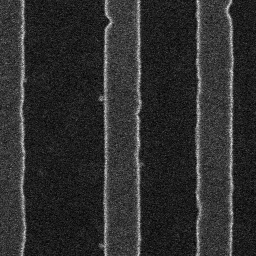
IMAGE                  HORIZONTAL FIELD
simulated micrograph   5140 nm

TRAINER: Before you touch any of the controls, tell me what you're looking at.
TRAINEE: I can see one or a few lines or trenches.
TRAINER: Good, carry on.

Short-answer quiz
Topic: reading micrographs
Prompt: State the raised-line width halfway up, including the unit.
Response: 673 nm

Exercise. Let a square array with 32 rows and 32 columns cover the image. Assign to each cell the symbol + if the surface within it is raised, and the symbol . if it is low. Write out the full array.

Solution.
+++..........++++........++++...
+++..........++++........+++....
+++...........+++........++++...
+++..........++++........++++...
+++..........++++........++++...
+++..........++++........++++...
+++..........++++........++++...
+++..........++++........++++...
+++..........++++........++++...
+++..........++++........++++...
+++..........++++........++++...
+++..........++++........++++...
+++..........++++........++++...
+++..........++++........++++...
+++..........++++........++++...
+++..........++++........++++...
+++..........++++........++++...
+++..........++++........++++...
+++..........++++........++++...
+++..........++++........++++...
+++..........++++........++++...
+++..........++++........++++...
+++..........++++........++++...
+++..........++++........++++...
+++..........++++........++++...
+++..........++++........++++...
+++..........++++........++++...
+++..........++++........++++...
+++..........++++........++++...
+++..........++++........++++...
+++..........++++........++++...
+++..........++++........++++...